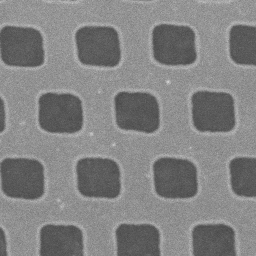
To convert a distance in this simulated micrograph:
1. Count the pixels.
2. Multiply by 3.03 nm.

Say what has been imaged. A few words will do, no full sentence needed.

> holes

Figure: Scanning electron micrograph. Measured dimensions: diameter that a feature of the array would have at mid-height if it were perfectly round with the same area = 47.9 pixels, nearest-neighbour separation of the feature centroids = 228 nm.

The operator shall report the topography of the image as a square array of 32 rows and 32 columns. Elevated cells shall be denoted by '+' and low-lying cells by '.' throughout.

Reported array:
++++++++++++++++++++++++++++++++
++++++++++++++++++++++++++++++++
++++++++++++++++++++++++++++++++
....++++++....+++++.....+++++...
.....++++......++++.....++++....
......+++......++++......++++...
......+++......++++......++++...
......++++.....++++......++++...
+++.++++++++++++++++++++++++++++
++++++++++++++++++++++++++++++++
++++++++++++++++++++++++++++++++
++++++.++++++++....+++++....++++
+++++.....++++......++++.....+++
.++++.....++++......++++.....+++
.++++.....++++......++++......++
.++++......+++......++++......++
++++++....+++++++...+++++....+++
++++++++++++++++++++++++++++++++
++++++++++++++++++++++++++++++++
++++++++++++++++++++.+++++++++++
.....++++......++++.....++++....
......+++......++++......++++...
......+++......++++......++++...
......++++.....++++......++++...
+....+++++.....+++++....++++++..
++++++++++++++++++++++++++++++++
++++++++++++++++++++++++++++++++
++++++++++++++++++++++++++++++++
+++++.....++++......++++.....+++
.++++.....++++......++++.....+++
.++++.....++++......++++......++
.++++......+++......++++......++